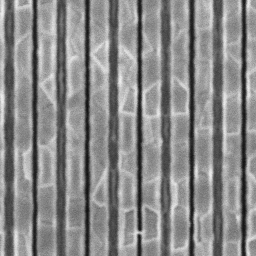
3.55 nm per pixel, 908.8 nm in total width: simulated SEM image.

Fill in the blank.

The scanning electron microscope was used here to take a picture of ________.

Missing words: parallel lines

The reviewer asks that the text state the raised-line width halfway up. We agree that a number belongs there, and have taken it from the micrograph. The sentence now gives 66.5 nm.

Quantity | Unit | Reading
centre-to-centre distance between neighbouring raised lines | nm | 92.6